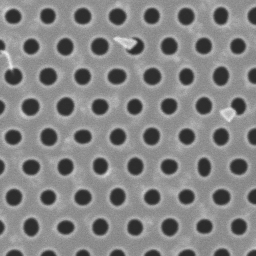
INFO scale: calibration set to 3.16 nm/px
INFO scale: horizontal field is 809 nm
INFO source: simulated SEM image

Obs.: a regular array of holes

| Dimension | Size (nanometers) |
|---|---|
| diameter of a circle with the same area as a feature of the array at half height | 52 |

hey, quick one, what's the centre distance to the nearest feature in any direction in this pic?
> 108 nm